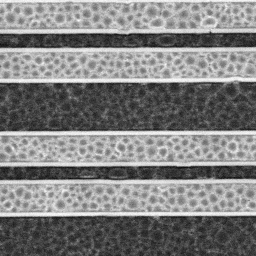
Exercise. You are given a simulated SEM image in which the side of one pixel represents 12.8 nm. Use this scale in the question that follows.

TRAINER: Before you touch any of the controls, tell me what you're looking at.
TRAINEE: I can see one or a few lines or trenches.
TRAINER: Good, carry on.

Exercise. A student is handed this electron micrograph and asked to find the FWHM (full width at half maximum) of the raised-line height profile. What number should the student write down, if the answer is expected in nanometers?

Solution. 397